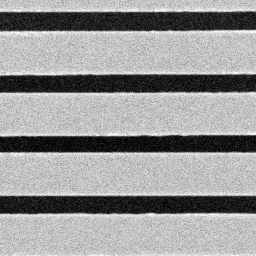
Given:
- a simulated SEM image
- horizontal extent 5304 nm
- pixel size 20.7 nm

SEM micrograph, lines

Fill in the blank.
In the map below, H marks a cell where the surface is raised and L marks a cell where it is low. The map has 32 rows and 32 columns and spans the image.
HHHHHHHHHHHHHHHHHHHHHHHHHHHHHHHH
LLLLLLLLLLLLLLLLLLLLLLLLLLLLLLLL
LLLLLLLLLLLLLLLLLLLLLLLLLLLLLLLL
LLLLLLLLLLLLLLLLLLLLLLLLLLLLLLLL
HHHHHHHHHHHHHHHHHHHHHHHHHHHHHHHH
HHHHHHHHHHHHHHHHHHHHHHHHHHHHHHHH
HHHHHHHHHHHHHHHHHHHHHHHHHHHHHHHH
HHHHHHHHHHHHHHHHHHHHHHHHHHHHHHHH
HHHHHHHHHHHHHHHHHHHHHHHHHHHHHHHH
LLLLLLLLLLLLLLLLLLLLLLLLLLLLLLLL
LLLLLLLLLLLLLLLLLLLLLLLLLLLLLLLL
LLLLLLLLLLLLLLLLLLLLLLLLLLLLLLLL
HHHHHHHHHHHHHHHHHHHHHHHHHHHHHHHH
HHHHHHHHHHHHHHHHHHHHHHHHHHHHHHHH
HHHHHHHHHHHHHHHHHHHHHHHHHHHHHHHH
HHHHHHHHHHHHHHHHHHHHHHHHHHHHHHHH
HHHHHHHHHHHHHHHHHHHHHHHHHHHHHHHH
LLLLLLLLLLLLLLLLLLLLLLLLLLLLLLLL
LLLLLLLLLLLLLLLLLLLLLLLLLLLLLLLL
HHHHHHHHHHHHHHHHHHHHHHHHHHHHHHHH
HHHHHHHHHHHHHHHHHHHHHHHHHHHHHHHH
HHHHHHHHHHHHHHHHHHHHHHHHHHHHHHHH
HHHHHHHHHHHHHHHHHHHHHHHHHHHHHHHH
HHHHHHHHHHHHHHHHHHHHHHHHHHHHHHHH
LLLLLLLLLLLLLLLLLLLLLLLLLLLLLLLL
LLLLLLLLLLLLLLLLLLLLLLLLLLLLLLLL
LLLLLLLLLLLLLLLLLLLLLLLLLLLLLLLL
HHHHHHHHHHHHHHHHHHHHHHHHHHHHHHHH
HHHHHHHHHHHHHHHHHHHHHHHHHHHHHHHH
HHHHHHHHHHHHHHHHHHHHHHHHHHHHHHHH
HHHHHHHHHHHHHHHHHHHHHHHHHHHHHHHH
HHHHHHHHHHHHHHHHHHHHHHHHHHHHHHHH